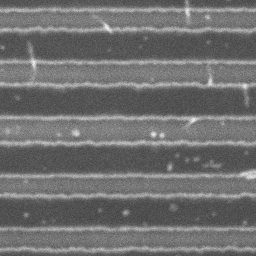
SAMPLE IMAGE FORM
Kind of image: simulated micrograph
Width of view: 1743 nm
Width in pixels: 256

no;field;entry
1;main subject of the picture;lines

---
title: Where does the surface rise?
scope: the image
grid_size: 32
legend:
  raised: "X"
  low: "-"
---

XXXXXXXXXXXXXXXXXXXXXXXXXXXXXXXX
--------------------------------
--------------------------------
--------------------------------
XXXXXXXXXXXXXXXXXXXXXXXXXXXXXXXX
XXXXXXXXXXXXXXXXXXXXXXXXXXXXXXXX
XXXXXXXXXXXXXXXXXXXXXXXXXXXXXXXX
XXXXXXXXXXXXXXXXXXXXXXXXXXXXXXXX
--------------------------------
--------------------------------
X---XX----X----X-----X----X-----
XXXXXXXXXXXXXXXXXXXXXXXXXXXXXXXX
XXXXXXXXXXXXXXXXXXXXXXXXXXXXXXXX
XXXXXXXXXXXXXXXXXXXXXXXXXXXXXXXX
XXXXXXXXXXXXXXXXXXXXXXXXXXXXXXXX
--------------------------------
--------------------------------
--------------------------------
XXXXXXXXXXXXXXXXXXXXXXXXXXXXXXXX
XXXXXXXXXXXXXXXXXXXXXXXXXXXXXXXX
XXXXXXXXXXXXXXXXXXXXXXXXXXXXXXXX
XXXXXXXXXXXXXXXXXXXXXXXXXXXXXXXX
--------------------------------
--------------------------------
XXXXXXXXXXXXXXXXXXXXXXXXXXXXXXXX
XXXXXXXXXXXXXXXXXXXXXXXXXXXXXXXX
XXXXXXXXXXXXXXXXXXXXXXXXXXXXXXXX
XXXXXXXXXXXXXXXXXXXXXXXXXXXXXXXX
XXXXXXXXXXXXXXXXXXXXXXXXXXXXXXXX
--------------------------------
--------------------------------
XXXXXXXXXXXXXXXXXXXXXXXXXXXXXXXX